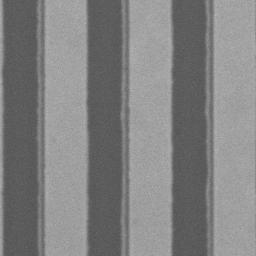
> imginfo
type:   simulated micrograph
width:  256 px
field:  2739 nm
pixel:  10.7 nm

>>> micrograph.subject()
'lines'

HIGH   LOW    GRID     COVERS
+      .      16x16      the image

..+++...+++..+++
..+++...+++..+++
..+++...+++..+++
..+++...+++..+++
..+++...+++..+++
..+++...+++..+++
..+++...+++..+++
..+++...+++..+++
..+++...+++..+++
..+++...+++..+++
..+++...+++..+++
..+++...+++..+++
..+++...+++..+++
..+++...+++..+++
..+++...+++..+++
...++...+++..+++